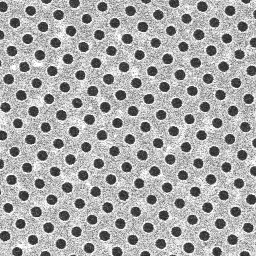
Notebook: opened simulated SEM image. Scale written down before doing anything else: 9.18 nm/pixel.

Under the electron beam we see a regular array of holes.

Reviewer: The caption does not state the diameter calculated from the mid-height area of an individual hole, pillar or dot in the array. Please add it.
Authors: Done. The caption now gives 0.0988 microns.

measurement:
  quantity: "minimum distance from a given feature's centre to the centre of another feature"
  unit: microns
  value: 0.18